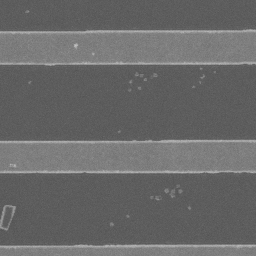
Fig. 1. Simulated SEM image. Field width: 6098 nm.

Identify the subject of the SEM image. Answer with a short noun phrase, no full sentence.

lines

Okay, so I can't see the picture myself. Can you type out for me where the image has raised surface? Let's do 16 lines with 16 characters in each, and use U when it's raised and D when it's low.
DDDDDDDDDDDDDDDD
DDDDDDDDDDDDDDDD
UUUUUUUUUUUUUUUU
UUUUUUUUUUUUUUUU
DDDDDDDDDDDDDDDD
DDDDDDDDDDDDDDDD
DDDDDDDDDDDDDDDD
DDDDDDDDDDDDDDDD
DDDDDDDDDDDDDDDD
UUUUUUUUUUUUUUUU
UUUUUUUUUUUUUUUU
DDDDDDDDDDDDDDDD
DDDDDDDDDDDDDDDD
UDDDDDDDDDDDDDDD
DDDDDDDDDDDDDDDD
UUUUUUUUUUUUUUUU